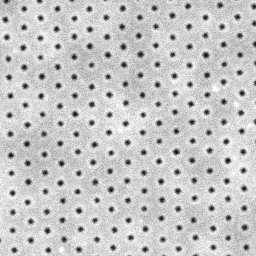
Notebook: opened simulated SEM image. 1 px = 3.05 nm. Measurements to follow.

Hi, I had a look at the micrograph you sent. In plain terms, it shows a regular array of holes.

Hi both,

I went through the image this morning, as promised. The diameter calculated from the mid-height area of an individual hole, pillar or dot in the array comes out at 19.8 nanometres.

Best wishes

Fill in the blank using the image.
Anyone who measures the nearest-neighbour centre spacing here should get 55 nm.